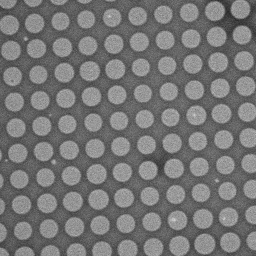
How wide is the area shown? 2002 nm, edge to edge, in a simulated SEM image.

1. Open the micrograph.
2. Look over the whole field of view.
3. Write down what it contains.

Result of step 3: an array of small figures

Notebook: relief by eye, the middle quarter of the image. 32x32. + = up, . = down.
++..++++...++++..++++...++++..++
++..+++++.+++++..++++...++++...+
++..+++++..++++...+++....+......
++...+++....++..................
................................
...................++....+++...+
+....+++...++++...++++..++++..++
++...++++..++++...++++..++++...+
+++..++++..++++...+++....+++...+
+++..++++...+++.................
++..............................
..........................++...+
............+++...++++...++++..+
++...++++...++++..++++...++++..+
+++..++++...++++..++++...+++...+
+++..++++...++++...++...........
++....++........................
................................
.............++....+++...++++..+
++....+++...++++...++++..++++..+
+++...++++..++++..+++++..++++...
++++..++++..++++...+++...++++...
+++...++++...++.................
++..............................
....................++....+++...
.......++....+++...++++..+++++..
+++...++++..+++++..++++..+++++..
++++..++++..+++++..++++...+++...
++++..++++...+++....++..........
++++...++.......................
................................
........+.....++....+++...++++..